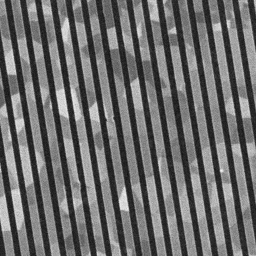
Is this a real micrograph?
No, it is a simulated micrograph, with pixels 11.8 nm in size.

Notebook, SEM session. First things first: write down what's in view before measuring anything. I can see parallel lines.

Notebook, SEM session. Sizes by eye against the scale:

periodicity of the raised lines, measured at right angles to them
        0.177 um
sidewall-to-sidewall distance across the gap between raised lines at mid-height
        0.0863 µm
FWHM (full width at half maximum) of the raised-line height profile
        7.77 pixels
